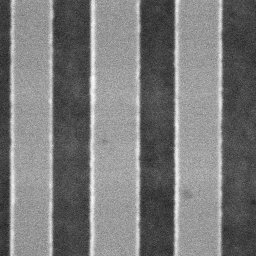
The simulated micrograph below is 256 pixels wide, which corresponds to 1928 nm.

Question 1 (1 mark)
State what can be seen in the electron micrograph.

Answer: lines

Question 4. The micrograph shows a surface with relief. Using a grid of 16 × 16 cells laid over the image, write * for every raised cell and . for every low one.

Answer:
.**...***..***..
.**...***..***..
.**...***..***..
.**...***..***..
.**...***..***..
.**...***..***..
.**...***..***..
.**...***..***..
.**...***..***..
.**...***..***..
.**...***..***..
.**...***..***..
.**...***..***..
.**...***..***..
.**...***..***..
.**...***..***..